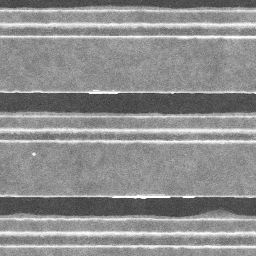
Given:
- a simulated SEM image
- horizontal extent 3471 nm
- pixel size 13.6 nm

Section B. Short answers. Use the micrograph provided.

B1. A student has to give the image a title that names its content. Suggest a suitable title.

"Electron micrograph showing lines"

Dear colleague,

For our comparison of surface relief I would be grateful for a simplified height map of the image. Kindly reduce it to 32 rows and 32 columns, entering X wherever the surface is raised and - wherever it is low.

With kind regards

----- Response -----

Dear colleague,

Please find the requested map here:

--------------------------------
XXXXXXXXXXXXXXXXXXXXXXXXXXXXXXXX
XXXXXXXXXXXXXXXXXXXXXXXXXXXXXXXX
XXXXXXXXXXXXXXXXXXXXXXXXXXXXXXXX
XXXXXXXXXXXXXXXXXXXXXXXXXXXXXXXX
XXXXXXXXXXXXXXXXXXXXXXXXXXXXXXXX
XXXXXXXXXXXXXXXXXXXXXXXXXXXXXXXX
XXXXXXXXXXXXXXXXXXXXXXXXXXXXXXXX
XXXXXXXXXXXXXXXXXXXXXXXXXXXXXXXX
XXXXXXXXXXXXXXXXXXXXXXXXXXXXXXXX
XXXXXXXXXXXXXXXXXXXXXXXXXXXXXXXX
XXXXXXXXXXXXXXXXXXXXXXXXXXXXXXXX
--------------------------------
--------------------------------
XXXXXXX----------------------X-X
XXXXXXXXXXXXXXXXXXXXXXXXXXXXXXXX
XXXXXXXXXXXXXXXXXXXXXXXXXXXXXXXX
XXXXXXXXXXXXXXXXXXXXXXXXXXXXXXXX
XXXXXXXXXXXXXXXXXXXXXXXXXXXXXXXX
XXXXXXXXXXXXXXXXXXXXXXXXXXXXXXXX
XXXXXXXXXXXXXXXXXXXXXXXXXXXXXXXX
XXXXXXXXXXXXXXXXXXXXXXXXXXXXXXXX
XXXXXXXXXXXXXXXXXXXXXXXXXXXXXXXX
XXXXXXXXXXXXXXXXXXXXXXXXXXXXXXXX
XXXXXXXXXXXXXXXXXXXXXXXXXXXXXXXX
--------------------------------
--------------------------------
XXXXXXXXXXXXXXXXXXXXXXXXXXXXXXXX
XXXXXXXXXXXXXXXXXXXXXXXXXXXXXXXX
XXXXXXXXXXXXXXXXXXXXXXXXXXXXXXXX
XXXXXXXXXXXXXXXXXXXXXXXXXXXXXXXX
XXXXXXXXXXXXXXXXXXXXXXXXXXXXXXXX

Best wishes